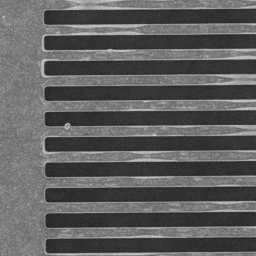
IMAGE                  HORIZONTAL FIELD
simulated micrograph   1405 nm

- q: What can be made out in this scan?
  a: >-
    groups of lines, slits or small figures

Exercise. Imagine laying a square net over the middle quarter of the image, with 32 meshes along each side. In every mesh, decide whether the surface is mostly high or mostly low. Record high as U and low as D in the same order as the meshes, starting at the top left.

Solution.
DDDDDDDDDDDDDDDDDDDDDDDDDDDDDDDD
DDDDDDDDDDDDDDDDDDDDDDDDDDDDDDDD
DDDDDDDDDDDDDDDDDDDDDDDDDDDDDDDD
UUUUUUUUUUUUUUUUUUUUUUUUUUUUUUUU
UUUUUUUUUUUUUUUUUUUUUUUUUUUUUUUU
DDDDDDDDDDDDDDDDDDDDDDDDDDDDDDDD
DDDDDDDDDDDDDDDDDDDDDDDDDDDDDDDD
DDDDDDDDDDDDDDDDDDDDDDDDDDDDDDDD
DDDDDDDDDDDDDDDDDDDDDDDDDDDDDDDD
UUUUUUUUUUUUUUUUUUUUUUUUUUUUUUUU
UUUUUUUUUUUUUUUUUUUUUUUUUUUUUUUU
UUUUUUUUUUUUUUUUDDDDDDDUUUUUUDDD
DDDDDDDDDDDDDDDDDDDDDDDDDDDDDDDD
DDDDDDDDDDDDDDDDDDDDDDDDDDDDDDDD
DDDDDDDDDDDDDDDDDDDDDDDDDDDDDDDD
UUDDDDDDDDDDDDDDDDDDDDDDDDDDDDDD
UUUUUUUUUUUUUUUUUUUUUUUUUUUUUUUU
UUUUUUUUUUUUUUUUUUUUUUUUUUUUUUUU
DDDDDDDDDDDDDDDDDDDDDDDDDDDDDDDD
DDDDDDDDDDDDDDDDDDDDDDDDDDDDDDDD
DDDDDDDDDDDDDDDDDDDDDDDDDDDDDDDD
DDDDDDDDDDDDDDDDDDDDDDDDDDDDDDDD
UUUUUUUUUUUUUUUUUUUUUUUUUUUUUUUU
UUUUUUUUUUUUUUUUUUUUUUUUUUUUUUUU
DDDDDDDDDDDDDDDDDDDDDDDDDDDDDDDD
DDDDDDDDDDDDDDDDDDDDDDDDDDDDDDDD
DDDDDDDDDDDDDDDDDDDDDDDDDDDDDDDD
DDDDDDDDDDDDDDDDDDDDDDDDDDDDDDDD
DDDDUUUUUUUUUUUUUDDDDDDDUUUUUUUU
UUUUUUUUUUUUUUUUUUUUUUUUUUUUUUUU
UUUUUUUUUUUUUUUUUUUUUUUUUUUUUUUU
DDDDDDDDDDDDDDDDDDDDDDDDDDDDDDDD